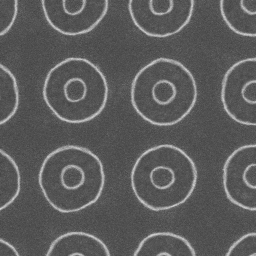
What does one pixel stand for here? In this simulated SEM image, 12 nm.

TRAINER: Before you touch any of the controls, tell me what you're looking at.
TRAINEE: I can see ring-shaped raised bodies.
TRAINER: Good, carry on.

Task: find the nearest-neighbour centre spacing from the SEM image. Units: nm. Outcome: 1040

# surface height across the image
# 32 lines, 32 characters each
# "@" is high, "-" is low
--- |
@@---@@@--@@@---@@@--@@@----@@--
@@----@@--@@@---@@@--@@@----@@@-
@@----@@@@@@-----@@@@@@-----@@@@
@------@@@@-------@@@@@------@@@
--------------------------------
--------------------------------
--------------------------------
---------@@---------@----------@
-------@@@@@------@@@@@------@@@
@-----@@@@@@@----@@@@@@@----@@@@
@@----@@--@@@----@@@-@@@----@@@-
@@----@@---@@----@@---@@----@@--
@@----@@@-@@@----@@@-@@@----@@@-
@@----@@@@@@@----@@@@@@@----@@@@
@------@@@@@------@@@@@------@@@
--------------------------------
--------------------------------
--------------------------------
--------@@---------@@@--------@@
@-----@@@@@@------@@@@@------@@@
@@---@@@@@@@@----@@@@@@@----@@@@
@@---@@@--@@@----@@--@@@----@@@-
@@---@@@--@@@----@@---@@----@@@-
@@---@@@@@@@@----@@@@@@@----@@@@
@@----@@@@@@-----@@@@@@------@@@
@-----@@@@@-------@@@@--------@@
--------------------------------
--------------------------------
--------------------------------
--------@@@--------@@@---------@
@------@@@@@@-----@@@@@------@@@
@@----@@@@@@@----@@@@@@@-----@@@